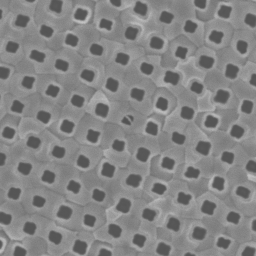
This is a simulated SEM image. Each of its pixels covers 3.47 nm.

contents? a regular array of holes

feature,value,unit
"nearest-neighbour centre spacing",91.4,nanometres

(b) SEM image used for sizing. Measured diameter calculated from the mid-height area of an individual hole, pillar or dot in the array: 42.5 nanometers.